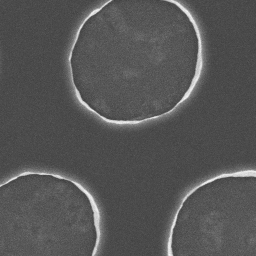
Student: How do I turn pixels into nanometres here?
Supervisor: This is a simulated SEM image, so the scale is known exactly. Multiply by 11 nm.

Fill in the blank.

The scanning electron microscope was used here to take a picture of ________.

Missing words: holes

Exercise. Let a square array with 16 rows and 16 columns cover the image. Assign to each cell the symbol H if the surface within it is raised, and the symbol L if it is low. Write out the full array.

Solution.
HHHHHHLLLLLHHHHH
HHHHHLLLLLLLHHHH
HHHHHLLLLLLLHHHH
HHHHLLLLLLLLLHHH
HHHHHLLLLLLLHHHH
HHHHHLLLLLLLHHHH
HHHHHLLLLLLHHHHH
HHHHHHHLLHHHHHHH
HHHHHHHHHHHHHHHH
HHHHHHHHHHHHHHHH
HHHHHHHHHHHHHHHH
LLLLLHHHHHHHHLLL
LLLLLLHHHHHHLLLL
LLLLLLHHHHHLLLLL
LLLLLLHHHHHLLLLL
LLLLLLHHHHHLLLLL